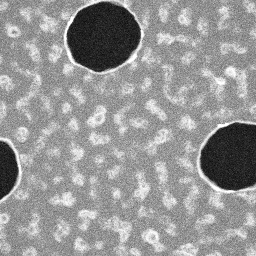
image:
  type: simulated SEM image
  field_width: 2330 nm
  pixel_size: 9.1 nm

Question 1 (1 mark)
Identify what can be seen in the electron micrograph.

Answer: holes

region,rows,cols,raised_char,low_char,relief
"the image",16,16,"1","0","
1111100011111111
1111000001111111
1111000001111111
1111000011111111
1111111111111111
1111111111111111
1111111111111111
1111111111111111
1111111111111000
0111111111111000
0111111111111000
0111111111111000
1111111111111111
1111111111111111
1111111111111111
1111111111111111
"